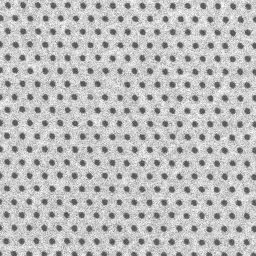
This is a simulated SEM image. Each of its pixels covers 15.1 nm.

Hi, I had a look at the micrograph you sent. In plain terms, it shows a regular array of holes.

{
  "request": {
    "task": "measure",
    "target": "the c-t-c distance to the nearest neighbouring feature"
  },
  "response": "221 nm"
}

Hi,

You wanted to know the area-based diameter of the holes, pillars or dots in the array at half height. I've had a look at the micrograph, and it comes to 6.58 pixels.